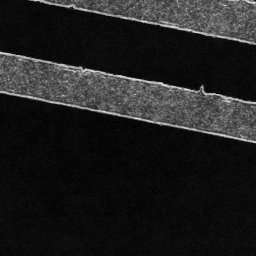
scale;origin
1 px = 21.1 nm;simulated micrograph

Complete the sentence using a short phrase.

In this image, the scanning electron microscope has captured one or a few lines or trenches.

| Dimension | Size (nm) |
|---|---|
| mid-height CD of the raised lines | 793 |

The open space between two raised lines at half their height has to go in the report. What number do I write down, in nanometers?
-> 1230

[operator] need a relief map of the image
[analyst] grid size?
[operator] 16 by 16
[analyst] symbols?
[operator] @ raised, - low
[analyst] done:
-----@@@@@@@@@@@
-----------@@@-@
---------------@
@---------------
@@@@@@----------
@@@@@@@@@@@-----
----@@@@@@@@@@@@
---------@@@@@@@
--------------@@
----------------
----------------
----------------
----------------
----------------
----------------
----------------